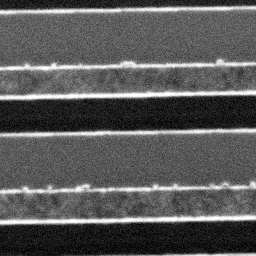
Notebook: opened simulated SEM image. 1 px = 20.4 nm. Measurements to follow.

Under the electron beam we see lines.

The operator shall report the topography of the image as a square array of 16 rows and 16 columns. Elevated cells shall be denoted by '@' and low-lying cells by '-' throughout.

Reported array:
----------------
@@@@@@@@@@@@@@@@
@@@@@@@@@@@@@@@@
@@@@@@@@@@@@@@@@
@@@@@@@@@@@@@@@@
@@@@@@@@@@@@@@@@
----------------
----------------
@@@@@@@@@@@@@@@@
@@@@@@@@@@@@@@@@
@@@@@@@@@@@@@@@@
@@@@@@@@@@@@@@@@
@@@@@@@@@@@@@@@@
@@@@@@@@@@@@@@@@
----------------
----------------